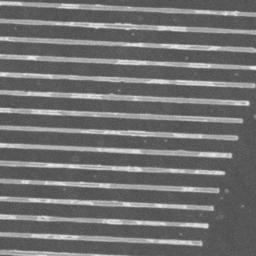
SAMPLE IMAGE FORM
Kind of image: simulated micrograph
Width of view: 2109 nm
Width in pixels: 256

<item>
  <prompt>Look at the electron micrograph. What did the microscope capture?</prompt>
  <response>parallel lines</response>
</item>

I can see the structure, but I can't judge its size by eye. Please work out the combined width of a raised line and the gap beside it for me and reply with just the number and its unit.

146 nm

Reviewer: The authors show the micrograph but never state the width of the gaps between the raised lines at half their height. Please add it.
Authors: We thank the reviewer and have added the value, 0.11 microns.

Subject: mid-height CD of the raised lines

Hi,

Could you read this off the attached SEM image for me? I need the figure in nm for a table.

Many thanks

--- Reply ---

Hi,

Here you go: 36